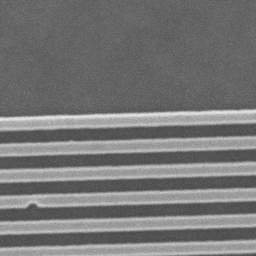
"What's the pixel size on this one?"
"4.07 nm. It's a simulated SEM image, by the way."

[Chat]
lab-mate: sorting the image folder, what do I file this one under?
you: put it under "parallel lines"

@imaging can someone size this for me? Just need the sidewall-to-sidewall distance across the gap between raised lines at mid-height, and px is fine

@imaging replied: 14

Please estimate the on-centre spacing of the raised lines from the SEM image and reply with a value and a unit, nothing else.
106 nanometres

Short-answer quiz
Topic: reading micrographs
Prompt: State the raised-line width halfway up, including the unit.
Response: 0.0488 um